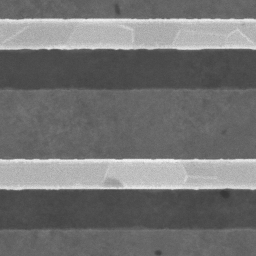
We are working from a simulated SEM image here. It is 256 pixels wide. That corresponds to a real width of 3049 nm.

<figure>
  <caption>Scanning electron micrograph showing lines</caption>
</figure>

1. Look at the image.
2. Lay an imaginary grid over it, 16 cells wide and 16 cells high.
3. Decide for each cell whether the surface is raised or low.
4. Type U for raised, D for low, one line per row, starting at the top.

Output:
UUUUUUUUUUUUUUUU
UUUUUUUUUUUUUUUU
UUUUUUUUUUUUUUUU
DDDDDDDDDDDDDDDD
DDDDDDDDDDDDDDDD
DDDDDDDDDDDDDDDD
UUUUUUUUUUUUUUUU
UUUUUUUUUUUUUUUU
UUUUUUUUUUUUUUUU
UUUUUUUUUUUUUUUU
UUUUUUUUUUUUUUUU
UUUUUUUUUUUUUUUU
DDDDDDDDDDDDDDDD
DDDDDDDDDDDDDDDD
UUUUUUUUUUUUUUUU
UUUUUUUUUUUUUUUU